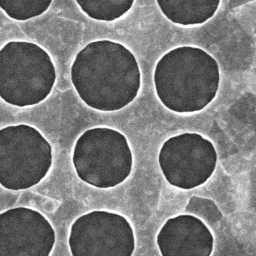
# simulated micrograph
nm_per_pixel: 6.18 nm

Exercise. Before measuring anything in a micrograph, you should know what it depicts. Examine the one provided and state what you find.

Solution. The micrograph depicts holes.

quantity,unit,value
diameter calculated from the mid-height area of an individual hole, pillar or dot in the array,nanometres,399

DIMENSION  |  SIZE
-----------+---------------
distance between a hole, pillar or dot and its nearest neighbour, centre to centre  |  498 nanometers